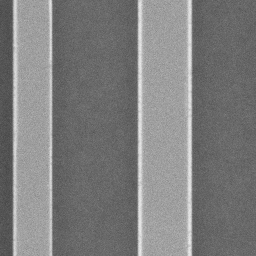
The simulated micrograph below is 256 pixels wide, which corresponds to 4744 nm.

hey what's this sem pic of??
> lines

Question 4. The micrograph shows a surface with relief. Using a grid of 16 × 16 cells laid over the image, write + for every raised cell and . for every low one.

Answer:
.++......+++....
.++......+++....
.++......+++....
.++......+++....
.++......+++....
.++......+++....
.++......+++....
.++......+++....
.++......+++....
.++......+++....
.++......+++....
.++......+++....
.++......+++....
.++......+++....
.++......+++....
.++......+++....